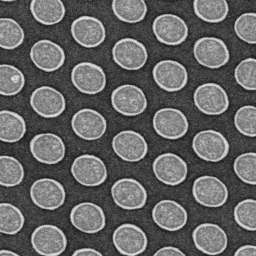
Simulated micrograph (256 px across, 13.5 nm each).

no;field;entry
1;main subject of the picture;a regular array of raised bodies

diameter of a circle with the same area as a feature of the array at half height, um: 0.422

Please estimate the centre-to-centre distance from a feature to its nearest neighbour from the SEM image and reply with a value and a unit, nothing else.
618 nm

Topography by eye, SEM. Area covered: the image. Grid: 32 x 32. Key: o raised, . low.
....oooo......oooo......oooo....
....oooo......oooo.......ooo....
o....ooo..oo...oo..oooo...o...oo
ooo......oooo......oooo......ooo
ooo......oooo.......ooo.......oo
oo..ooo...oo...oo....o...ooo....
....oooo......oooo......oooo....
....oooo......oooo.......ooo...o
oo...oo..ooo....o..oooo.......oo
ooo......oooo......oooo......ooo
ooo......oooo.......ooo.......oo
oo..ooo....o..oooo.......ooo....
....oooo......oooo......oooo....
....oooo......oooo.......ooo..oo
oo....o..oooo......oooo......ooo
ooo......oooo......oooo......ooo
ooo......oooo.......ooo..oo...oo
oo..oooo......oooo......oooo....
....oooo......oooo......oooo....
....oooo.......ooo..oo...ooo..oo
oo.......oooo......oooo......ooo
ooo......oooo......oooo......ooo
ooo..o....ooo..o....ooo..oo...oo
....oooo......oooo......oooo....
....oooo......oooo......oooo....
.....ooo..oo...ooo..oo...ooo..oo
oo.......oooo......oooo......ooo
ooo......oooo......oooo.......oo
ooo..oo...ooo..oo...oo...oo....o
....oooo......oooo......oooo....
....oooo......oooo.......ooo....
o....ooo..oo...oo...ooo...oo..oo